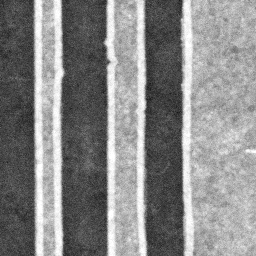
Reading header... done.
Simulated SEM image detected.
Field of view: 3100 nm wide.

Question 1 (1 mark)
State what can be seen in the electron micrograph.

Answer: one or a few lines or trenches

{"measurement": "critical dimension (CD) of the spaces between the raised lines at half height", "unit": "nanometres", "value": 607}